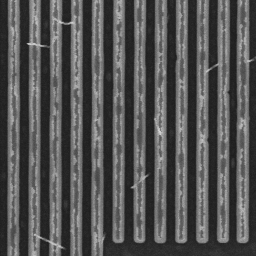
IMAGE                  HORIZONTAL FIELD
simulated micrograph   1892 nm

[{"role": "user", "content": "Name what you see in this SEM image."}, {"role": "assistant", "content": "parallel lines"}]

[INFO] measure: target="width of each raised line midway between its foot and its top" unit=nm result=64.7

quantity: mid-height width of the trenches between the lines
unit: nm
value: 93.3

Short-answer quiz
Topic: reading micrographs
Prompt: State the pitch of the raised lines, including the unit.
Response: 154 nanometres